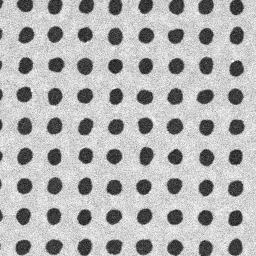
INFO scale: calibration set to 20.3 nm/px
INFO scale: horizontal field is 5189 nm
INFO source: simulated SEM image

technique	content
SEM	a regular array of holes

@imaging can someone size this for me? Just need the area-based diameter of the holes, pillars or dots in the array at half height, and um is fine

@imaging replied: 0.323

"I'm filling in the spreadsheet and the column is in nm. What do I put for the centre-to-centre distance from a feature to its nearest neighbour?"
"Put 596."